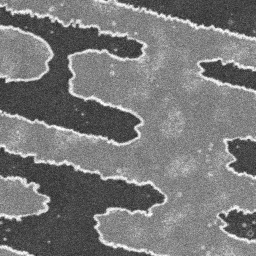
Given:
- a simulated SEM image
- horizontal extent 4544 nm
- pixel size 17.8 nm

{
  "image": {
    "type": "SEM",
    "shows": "one or a few lines or trenches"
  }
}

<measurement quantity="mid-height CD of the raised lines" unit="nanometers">628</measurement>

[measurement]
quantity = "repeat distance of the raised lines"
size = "1250 nanometres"